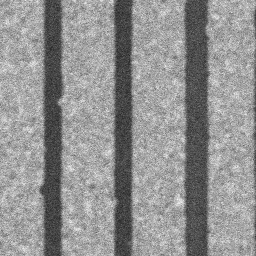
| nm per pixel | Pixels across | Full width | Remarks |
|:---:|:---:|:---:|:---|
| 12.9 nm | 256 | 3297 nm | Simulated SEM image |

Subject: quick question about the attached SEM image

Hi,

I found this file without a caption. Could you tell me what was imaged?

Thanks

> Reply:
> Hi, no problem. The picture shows one or a few lines or trenches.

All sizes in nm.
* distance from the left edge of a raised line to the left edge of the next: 921